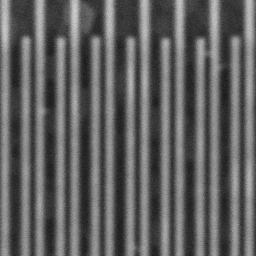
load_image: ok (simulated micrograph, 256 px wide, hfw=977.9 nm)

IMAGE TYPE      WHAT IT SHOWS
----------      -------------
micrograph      parallel lines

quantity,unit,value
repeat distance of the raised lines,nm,66.6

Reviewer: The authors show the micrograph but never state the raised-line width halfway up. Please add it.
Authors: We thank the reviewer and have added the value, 29.6 nm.